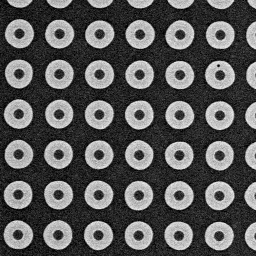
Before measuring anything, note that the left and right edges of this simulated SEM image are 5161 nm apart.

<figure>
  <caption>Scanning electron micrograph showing an array of small figures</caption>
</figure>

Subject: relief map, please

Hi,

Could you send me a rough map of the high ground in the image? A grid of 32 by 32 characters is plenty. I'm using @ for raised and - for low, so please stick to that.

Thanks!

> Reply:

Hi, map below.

-@@@--@@@--@@@--@@@--@@@--@@@--@
--------------------------------
--@-----------------------------
-@@@--@@@--@@@--@@@--@@@--@@@--@
-@@@--@@@--@@@--@@@--@@@--@@@--@
-@@@--@@@--@@@--@@@--@@@--@@@--@
--------------------------------
--------------------------------
-@@@--@@@--@@@--@@@--@@@--@@@--@
-@@@--@@@--@@@--@@@--@@@--@@@--@
-@@@--@@@--@@@--@@@--@@@--@@@--@
--------------------------------
--@-----------------------------
-@@@--@@@--@@@--@@@--@@@--@@@--@
-@@@--@@@--@@@--@@@--@@@--@@@--@
-@@@--@@@--@@@--@@@--@@@--@@@--@
--------------------------------
--------------------------------
-@@@--@@@--@@@--@@@--@@@--@@@--@
-@@@--@@@--@@@--@@@--@@@--@@@--@
-@@@--@@@--@@@--@@@--@@@--@@@--@
--------------------------------
--------------------------------
-@@@--@@@--@@@--@@@--@@@--@@@--@
-@@@--@@@--@@@--@@@--@@@--@@@--@
-@@@--@@@--@@@--@@@--@@@--@@@--@
--------------------------------
--------------------------------
-@@@--@@@--@@@--@@@--@@@--@@@--@
-@@@-@@@@--@@@--@@@--@@@--@@@--@
-@@@--@@@--@@@--@@@--@@@--@@@--@
--------------------------------